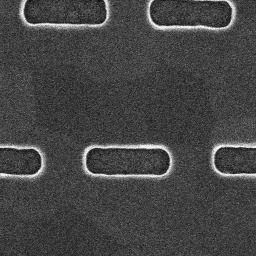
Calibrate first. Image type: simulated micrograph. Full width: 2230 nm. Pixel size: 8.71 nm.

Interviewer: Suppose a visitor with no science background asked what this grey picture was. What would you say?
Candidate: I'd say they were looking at holes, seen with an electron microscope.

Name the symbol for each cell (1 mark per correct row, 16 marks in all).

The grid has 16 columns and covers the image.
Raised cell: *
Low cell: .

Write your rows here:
**.....**.....**
***...****....**
****************
****************
****************
****************
****************
****************
****************
..****....****..
..****....****..
****************
****************
****************
****************
****************